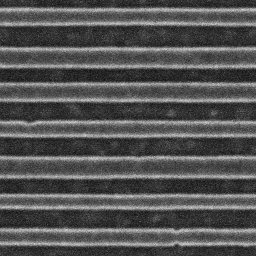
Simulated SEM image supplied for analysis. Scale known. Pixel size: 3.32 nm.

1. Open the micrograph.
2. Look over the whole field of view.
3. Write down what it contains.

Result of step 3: parallel lines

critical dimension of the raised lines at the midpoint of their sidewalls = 49.7 nanometres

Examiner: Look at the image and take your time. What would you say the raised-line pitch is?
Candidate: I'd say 122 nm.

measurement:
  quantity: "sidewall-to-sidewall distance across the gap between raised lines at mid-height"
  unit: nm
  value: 69.2